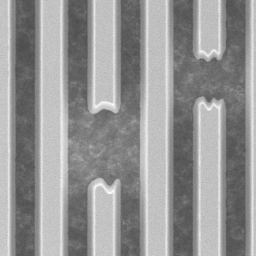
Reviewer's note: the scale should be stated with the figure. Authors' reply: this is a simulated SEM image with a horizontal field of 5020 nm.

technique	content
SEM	parallel lines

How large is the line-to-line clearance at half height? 554 nm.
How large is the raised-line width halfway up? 483 nanometres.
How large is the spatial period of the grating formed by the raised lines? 1030 nm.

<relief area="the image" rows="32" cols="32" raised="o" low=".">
o....ooo...ooo....ooo....ooo...o
o....ooo...ooo....ooo....ooo...o
o....ooo...ooo....ooo....ooo...o
o....ooo...oooo...ooo....ooo...o
o....ooo...oooo...ooo....ooo...o
o....ooo...ooo....ooo....ooo...o
o....ooo...oooo...ooo....ooo...o
o....ooo...oooo...ooo..........o
o....ooo...oooo...ooo..........o
o....ooo...ooo....ooo..........o
o....ooo...ooo....ooo..........o
o....ooo...ooo....ooo..........o
o....ooo...ooo....ooo..........o
o....ooo..........ooo....ooo...o
o....ooo..........ooo....ooo...o
o....ooo..........ooo....ooo...o
o....ooo..........ooo....ooo...o
o....ooo..........ooo....ooo...o
o....ooo..........ooo....ooo...o
o....ooo..........ooo....ooo...o
o....ooo..........ooo....ooo...o
o....ooo..........ooo....ooo...o
o....ooo..........ooo....ooo...o
o....ooo....o.....ooo....ooo...o
o....ooo...ooo....ooo....ooo...o
o....ooo...oooo...ooo....ooo...o
o....ooo...oooo...ooo....ooo...o
o....ooo...ooo....ooo....ooo...o
o....ooo...ooo....ooo....ooo...o
o....ooo...ooo....ooo....ooo...o
o....ooo...ooo....ooo....ooo...o
o....ooo...ooo....ooo....ooo...o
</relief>